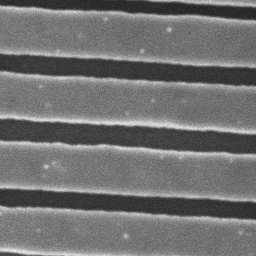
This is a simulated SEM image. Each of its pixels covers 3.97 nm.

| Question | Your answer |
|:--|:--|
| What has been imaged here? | lines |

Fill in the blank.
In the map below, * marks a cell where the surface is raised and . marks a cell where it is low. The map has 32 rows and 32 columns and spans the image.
..........................******
***************.................
******************************..
********************************
********************************
********************************
********************************
................****************
................................
*****...........................
**************************......
********************************
********************************
********************************
********************************
..............******************
.............................***
................................
****************................
********************************
********************************
********************************
********************************
..******************************
....................************
................................
**************..................
******************************..
********************************
********************************
********************************
.*******************************